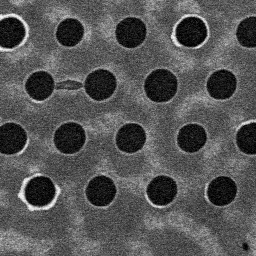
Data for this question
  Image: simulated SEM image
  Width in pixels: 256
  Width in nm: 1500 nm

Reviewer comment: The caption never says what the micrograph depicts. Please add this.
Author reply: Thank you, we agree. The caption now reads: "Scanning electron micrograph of a regular array of holes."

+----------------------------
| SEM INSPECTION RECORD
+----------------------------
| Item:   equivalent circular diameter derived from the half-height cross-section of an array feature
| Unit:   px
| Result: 31.1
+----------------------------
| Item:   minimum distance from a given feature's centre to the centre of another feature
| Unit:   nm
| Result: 354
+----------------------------